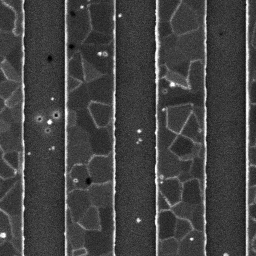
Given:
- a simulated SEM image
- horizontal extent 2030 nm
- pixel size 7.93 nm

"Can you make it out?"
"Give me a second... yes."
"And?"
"lines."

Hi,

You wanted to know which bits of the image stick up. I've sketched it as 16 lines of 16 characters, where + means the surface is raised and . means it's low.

+...+++...+++..+
+...+++...+++..+
+...+++...+++..+
+...+++...+++..+
+...+++...+++..+
+...+++...+++..+
+...+++...+++..+
+...+++...+++..+
+...+++...+++..+
+...+++...+++..+
+...+++...+++..+
+...+++...+++..+
+...+++...+++..+
+...+++...+++..+
+...+++...+++..+
+...+++...+++..+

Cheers